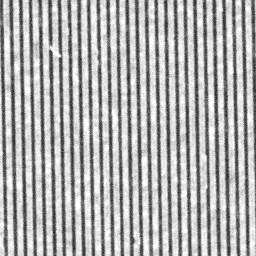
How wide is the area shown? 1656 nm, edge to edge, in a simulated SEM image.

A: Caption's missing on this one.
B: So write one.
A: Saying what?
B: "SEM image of parallel lines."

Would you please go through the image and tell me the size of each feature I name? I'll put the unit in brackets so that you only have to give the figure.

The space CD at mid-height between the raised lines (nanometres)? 33.2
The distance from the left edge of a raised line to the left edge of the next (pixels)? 9.68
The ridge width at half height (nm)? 33.2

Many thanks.